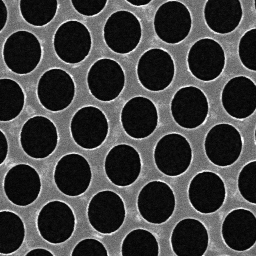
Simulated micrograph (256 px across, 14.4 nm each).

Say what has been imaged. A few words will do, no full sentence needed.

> a regular array of holes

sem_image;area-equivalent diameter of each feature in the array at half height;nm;573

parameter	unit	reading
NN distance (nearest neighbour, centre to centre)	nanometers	724